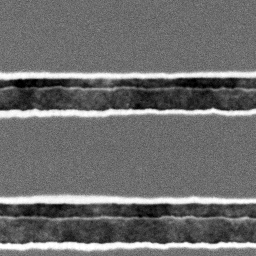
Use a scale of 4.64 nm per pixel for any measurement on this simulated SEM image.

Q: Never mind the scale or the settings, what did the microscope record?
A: lines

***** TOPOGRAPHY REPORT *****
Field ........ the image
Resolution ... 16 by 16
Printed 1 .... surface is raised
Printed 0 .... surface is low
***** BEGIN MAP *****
1111111111111111
1111111111111111
1111111111111111
1111111111111111
1111111111111111
0000000000000000
0000000000000000
1111111111111111
1111111111111111
1111111111111111
1111111111111111
1111111111111111
1111111111111111
0000000000000000
0000000000000000
1111111111111111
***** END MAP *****